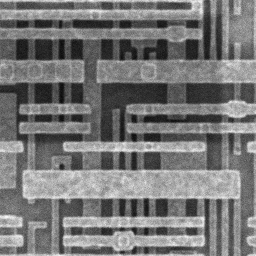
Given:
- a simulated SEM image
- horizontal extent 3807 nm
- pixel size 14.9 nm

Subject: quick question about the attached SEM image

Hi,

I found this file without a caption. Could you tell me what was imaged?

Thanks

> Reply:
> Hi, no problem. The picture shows wiring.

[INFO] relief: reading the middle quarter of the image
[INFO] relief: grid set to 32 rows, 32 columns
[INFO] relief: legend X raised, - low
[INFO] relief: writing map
XXXXX---XXXXXXXXXXXXXXXXXXXXXXXX
XXXXX---XXXXXXXXXXXXXXXXXXXXXXXX
XXXXX---XXXXXXXXXXXXXXXXXXXXXXXX
XXXXX---XXXXXXXXXXXXXXXXXXXXXXXX
XXXX----XXXX--XXXXXXXXXXXXXXXXXX
--------------------------------
--------------------------------
--------------------------------
--------------------------------
--------------------------------
XXXXXX----------XXXXXXXXXXXXXXXX
XXXXXX----------XXXXXXXXXXXXXXXX
--------------------------------
--------------------------------
--------------------------------
XXXXXX----------XXXXXXXXXXXXXXXX
XXXXXX----------XXXXXXXXXXXXXXXX
--------------------------------
--------------------------------
--------------------------------
XXXXXXXXXXXXXXXXXXXXXXXXXXXXXXXX
XXXXXXXXXXXXXXXXXXXXXXXXXXXXXXXX
--------------------------------
--------------------------------
--------------------------------
--------------------------------
--------------------------------
XXXXXXXXXXXXXXXXXXXXXXXXXXXXXXXX
XXXXXXXXXXXXXXXXXXXXXXXXXXXXXXXX
XXXXXXXXXXXXXXXXXXXXXXXXXXXXXXXX
XXXXXXXXXXXXXXXXXXXXXXXXXXXXXXXX
XXXXXXXXXXXXXXXXXXXXXXXXXXXXXXXX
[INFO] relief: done